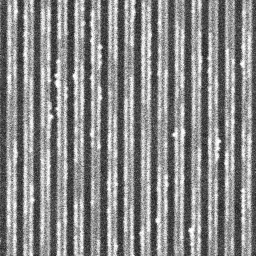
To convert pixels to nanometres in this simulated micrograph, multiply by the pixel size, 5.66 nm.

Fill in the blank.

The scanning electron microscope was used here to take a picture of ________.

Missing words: parallel lines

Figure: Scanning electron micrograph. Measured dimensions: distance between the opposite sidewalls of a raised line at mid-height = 48.8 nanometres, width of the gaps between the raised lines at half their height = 7.63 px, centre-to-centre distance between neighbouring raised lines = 0.0948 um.